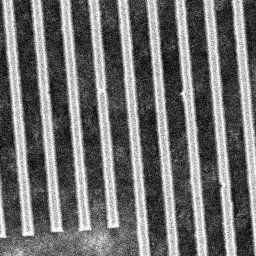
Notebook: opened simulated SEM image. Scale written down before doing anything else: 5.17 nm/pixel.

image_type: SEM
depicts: parallel lines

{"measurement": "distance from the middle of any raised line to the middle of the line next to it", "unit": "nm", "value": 148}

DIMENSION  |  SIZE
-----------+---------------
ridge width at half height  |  48.2 nanometers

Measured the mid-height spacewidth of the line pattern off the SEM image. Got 101 nanometres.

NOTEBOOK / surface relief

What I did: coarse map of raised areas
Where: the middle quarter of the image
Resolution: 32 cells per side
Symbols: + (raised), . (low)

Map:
.++.....++.....++.....++.....+++
.++.....++.....++.....++.....++.
.++.....++.....++.....+++....+++
.++.....++.....+++....+++.....++
.++.....++.....+++.....++.....++
.++.....++.....+++.....++.....++
.++.....++......++.....++.....++
.++.....+++.....++.....++....+++
.+++....+++.....++.....++.....++
.+++.....++.....++.....++.....++
.+++.....++.....++.....++.....++
.+++.....++.....++.....++.....++
..++.....++.....++.....++......+
..++.....++.....++.....+++.....+
..++.....++.....+++....+++.....+
..++.....++.....++......++.....+
..++.....++.....+++....+++.....+
..++.....++......++.....++.....+
..++.....+++.....++.....++.....+
..++.....+++.....++.....++.....+
..+++.....++.....++.....++.....+
...++.....++.....++.....++.....+
...++.....++.....++.....++.....+
...++.....++.....++.....++......
...++.....++.....++.....+++.....
...++.....++.....+++....+++.....
...++.....++......++.....++.....
...++.....++.....+++.....++.....
...++.....++.....+++.....++.....
...++.....++......++.....++.....
...+++....+++.....++.....++.....
...+++....+++.....++.....++.....